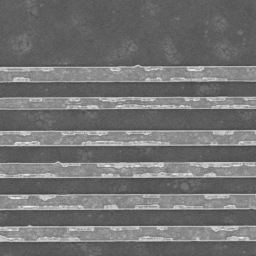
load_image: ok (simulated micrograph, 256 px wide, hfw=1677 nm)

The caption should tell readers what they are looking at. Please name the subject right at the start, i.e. parallel lines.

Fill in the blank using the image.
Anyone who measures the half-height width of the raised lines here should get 0.0926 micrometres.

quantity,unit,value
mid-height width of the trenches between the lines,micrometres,0.116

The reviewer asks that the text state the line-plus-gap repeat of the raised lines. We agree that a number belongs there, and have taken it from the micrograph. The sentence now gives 209 nanometers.